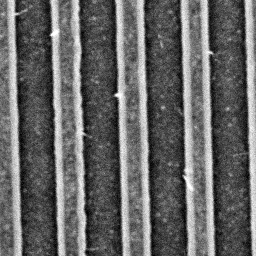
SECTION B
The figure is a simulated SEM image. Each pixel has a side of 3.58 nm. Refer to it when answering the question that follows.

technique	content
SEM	one or a few lines or trenches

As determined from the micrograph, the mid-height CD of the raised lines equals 78.2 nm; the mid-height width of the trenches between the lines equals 154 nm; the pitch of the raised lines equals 231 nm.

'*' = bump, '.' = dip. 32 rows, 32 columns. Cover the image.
*......***.....***.....***.....*
**.....***.....***.....***.....*
*......**......***.....***.....*
*......**......***.....***.....*
*......***.....***.....***.....*
**.....***.....***.....***.....*
**.....***.....***.....***.....*
**.....***.....***.....***.....*
**.....***.....***.....***.....*
**.....***.....***.....***.....*
**.....***.....***.....***.....*
**.....***.....***.....***.....*
**.....***.....***.....***.....*
**.....***.....***.....***.....*
**.....***.....***.....***.....*
**.....***.....***.....***.....*
**.....***.....***......**......
**.....***.....***.....***......
**.....***.....***.....***......
**.....***.....***......**......
**.....***.....***......**......
**.....***.....***.....***......
**.....***.....***......**......
**.....***......**......**......
**.....***......**......**......
**......**......**......**......
**......**......**......**......
**......**......**......**......
**......**......**......**......
**......**......**......**......
**......**......**......**......
**......**......**......**......